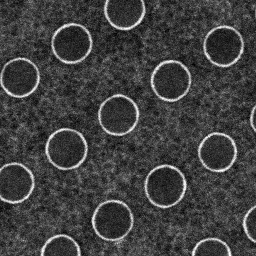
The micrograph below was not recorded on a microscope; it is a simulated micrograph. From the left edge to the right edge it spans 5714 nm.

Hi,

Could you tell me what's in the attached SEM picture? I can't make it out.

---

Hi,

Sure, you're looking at a regular array of raised bodies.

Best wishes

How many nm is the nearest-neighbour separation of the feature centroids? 1400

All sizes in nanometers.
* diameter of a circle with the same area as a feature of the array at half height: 874